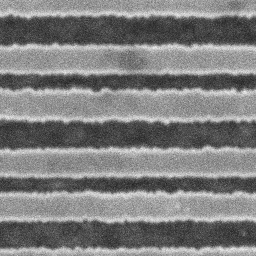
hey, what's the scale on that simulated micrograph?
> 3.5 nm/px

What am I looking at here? lines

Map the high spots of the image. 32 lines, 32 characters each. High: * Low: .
********************************
********************************
................................
................................
................................
................................
********************************
********************************
********************************
................................
................................
********************************
********************************
********************************
********************************
................................
................................
................................
.........................**.*...
********************************
********************************
********************************
................................
................................
********************************
********************************
********************************
***********************.********
................................
................................
................................
********************************